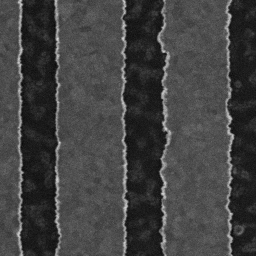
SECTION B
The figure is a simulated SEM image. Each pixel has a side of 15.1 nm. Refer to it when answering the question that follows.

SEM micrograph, one or a few lines or trenches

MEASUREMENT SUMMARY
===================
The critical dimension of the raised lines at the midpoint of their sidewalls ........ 1.01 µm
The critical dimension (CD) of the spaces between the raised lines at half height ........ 0.562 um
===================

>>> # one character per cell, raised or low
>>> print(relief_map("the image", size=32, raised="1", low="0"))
11100001111111110000011111111000
11100001111111110000111111111000
11100001111111100000011111111000
11100001111111110000111111111000
11100001111111110000111111111000
11100001111111110000111111111000
11100001111111100000011111111000
11000001111111110000011111111000
11000001111111100000011111111000
11100001111111100000011111111000
11000001111111110000111111111000
11000001111111100000111111111000
11100001111111100000111111111000
11100001111111110000011111110000
11000001111111100000011111111000
11100001111111100000011111111000
11000001111111110000011111111000
11000001111111100000011111111000
11000001111111110000011111111000
11100001111111110000111111111000
11100001111111110000111111111000
11100001111111110000111111111000
11100001111111110000111111111000
11100001111111110000111111111000
11100001111111110000111111111000
11100001111111110000111111110000
11100001111111110000111111111000
11100001111111110000111111111000
11100001111111110000111111111000
11000001111111110000111111111000
11100001111111110000111111111000
11100001111111110000111111111000